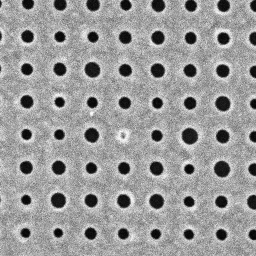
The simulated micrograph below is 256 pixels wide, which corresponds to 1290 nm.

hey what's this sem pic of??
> a regular array of holes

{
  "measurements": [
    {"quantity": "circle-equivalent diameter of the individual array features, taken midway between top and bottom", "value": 64.1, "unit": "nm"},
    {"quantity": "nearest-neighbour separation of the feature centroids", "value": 164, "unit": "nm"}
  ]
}